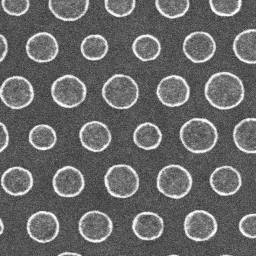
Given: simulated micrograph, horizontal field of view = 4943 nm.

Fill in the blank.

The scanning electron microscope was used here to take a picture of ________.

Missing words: a regular array of raised bodies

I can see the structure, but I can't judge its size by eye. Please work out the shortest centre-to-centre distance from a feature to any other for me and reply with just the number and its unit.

986 nanometers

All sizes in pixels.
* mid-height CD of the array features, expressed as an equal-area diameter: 30.5